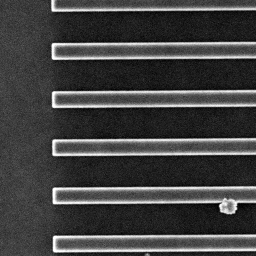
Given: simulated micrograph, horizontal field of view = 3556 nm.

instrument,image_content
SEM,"groups of lines, slits or small figures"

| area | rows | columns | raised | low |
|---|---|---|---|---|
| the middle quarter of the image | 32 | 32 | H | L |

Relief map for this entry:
LLLLLLLLLLLLLLLLLLLLLLLLLLLLLLLL
LLLLLLLLLLLLLLLLLLLLLLLLLLLLLLLL
LLLLLLLLLLLLLLLLLLLLLLLLLLLLLLLL
LLLLLLLLLLLLLLLLLLLLLLLLLLLLLLLL
LLLLLLLLLLLLLLLLLLLLLLLLLLLLLLLL
LLLLLLLLLLLLLLLLLLLLLLLLLLLLLLLL
LLLLLLLLLLLLLLLLLLLLLLLLLLLLLLLL
HHHHHHHHHHHHHHHHHHHHHHHHHHHHHHHH
HHHHHHHHHHHHHHHHHHHHHHHHHHHHHHHH
HHHHHHHHHHHHHHHHHHHHHHHHHHHHHHHH
HHHHHHHHHHHHHHHHHHHHHHHHHHHHHHHH
LLLLLLLLLLLLLLLLLLLLLLLLLLLLLLLL
LLLLLLLLLLLLLLLLLLLLLLLLLLLLLLLL
LLLLLLLLLLLLLLLLLLLLLLLLLLLLLLLL
LLLLLLLLLLLLLLLLLLLLLLLLLLLLLLLL
LLLLLLLLLLLLLLLLLLLLLLLLLLLLLLLL
LLLLLLLLLLLLLLLLLLLLLLLLLLLLLLLL
LLLLLLLLLLLLLLLLLLLLLLLLLLLLLLLL
LLLLLLLLLLLLLLLLLLLLLLLLLLLLLLLL
HHHHHHHHHHHHHHHHHHHHHHHHHHHHHHHH
HHHHHHHHHHHHHHHHHHHHHHHHHHHHHHHH
HHHHHHHHHHHHHHHHHHHHHHHHHHHHHHHH
HHHHHHHHHHHHHHHHHHHHHHHHHHHHHHHH
LLLLLLLLLLLLLLLLLLLLLLLLLLLLLLLL
LLLLLLLLLLLLLLLLLLLLLLLLLLLLLLLL
LLLLLLLLLLLLLLLLLLLLLLLLLLLLLLLL
LLLLLLLLLLLLLLLLLLLLLLLLLLLLLLLL
LLLLLLLLLLLLLLLLLLLLLLLLLLLLLLLL
LLLLLLLLLLLLLLLLLLLLLLLLLLLLLLLL
LLLLLLLLLLLLLLLLLLLLLLLLLLLLLLLL
LLLLLLLLLLLLLLLLLLLLLLLLLLLLLLLL
HHHHHHHHHHHHHHHHHHHHHHHHHHHHHHHH